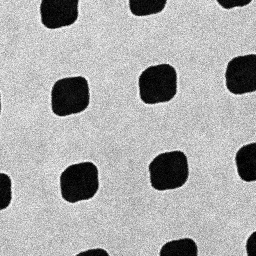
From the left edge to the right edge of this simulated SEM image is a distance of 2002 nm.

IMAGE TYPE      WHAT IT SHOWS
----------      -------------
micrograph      holes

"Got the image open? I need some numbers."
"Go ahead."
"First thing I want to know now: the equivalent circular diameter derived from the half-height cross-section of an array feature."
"320 nm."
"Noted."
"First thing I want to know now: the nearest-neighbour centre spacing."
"680 nanometers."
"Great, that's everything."